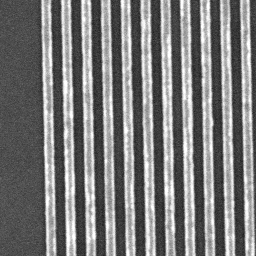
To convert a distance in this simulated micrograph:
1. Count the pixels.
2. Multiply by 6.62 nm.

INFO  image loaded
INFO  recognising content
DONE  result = parallel lines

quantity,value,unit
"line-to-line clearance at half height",80.3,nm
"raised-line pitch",0.132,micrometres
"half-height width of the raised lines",7.87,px